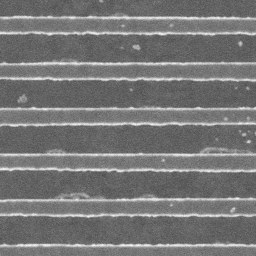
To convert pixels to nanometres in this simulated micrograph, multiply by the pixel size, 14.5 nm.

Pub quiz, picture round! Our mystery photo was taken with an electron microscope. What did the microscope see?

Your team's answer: lines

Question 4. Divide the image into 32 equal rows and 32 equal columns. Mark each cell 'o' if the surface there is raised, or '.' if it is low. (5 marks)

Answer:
................................
................................
oooooooooooooooooooooooooooooooo
oooooooooooooooooooooooooooooooo
................................
................................
................................
................................
oooooooooooooooooooooooooooooooo
oooooooooooooooooooooooooooooooo
................................
................................
................................
....o.........o.o..o....o....ooo
oooooooooooooooooooooooooooooooo
ooooooooooooooooooooo.o..oo.....
................................
................................
................................
oooooooooooooooooooooooooooooooo
oooooooooooooooooooooooooooooooo
................................
................................
................................
................................
oooooooooooooooooooooooooooooooo
oooooooooooooooooooooooooooooooo
................................
................................
................................
................................
oooooooooooooooooooooooooooooooo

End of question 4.